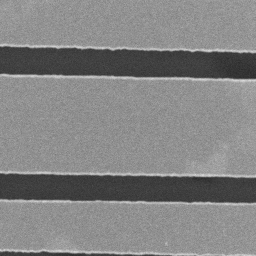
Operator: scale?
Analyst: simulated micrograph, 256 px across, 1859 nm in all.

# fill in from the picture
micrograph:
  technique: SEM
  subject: lines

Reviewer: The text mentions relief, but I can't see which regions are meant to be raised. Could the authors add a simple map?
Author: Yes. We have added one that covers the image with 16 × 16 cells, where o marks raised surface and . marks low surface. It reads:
oooooooooooooooo
oooooooooooooooo
oooooooooooooooo
................
................
oooooooooooooooo
oooooooooooooooo
oooooooooooooooo
oooooooooooooooo
oooooooooooooooo
oooooooooooooooo
................
o...............
oooooooooooooooo
oooooooooooooooo
oooooooooooooooo